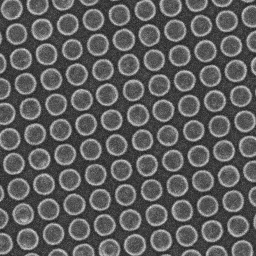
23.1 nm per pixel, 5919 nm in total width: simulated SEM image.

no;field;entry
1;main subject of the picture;a regular array of raised bodies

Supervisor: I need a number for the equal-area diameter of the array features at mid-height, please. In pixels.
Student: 20.3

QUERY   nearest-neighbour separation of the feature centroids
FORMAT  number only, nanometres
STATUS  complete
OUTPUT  585